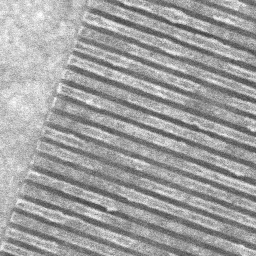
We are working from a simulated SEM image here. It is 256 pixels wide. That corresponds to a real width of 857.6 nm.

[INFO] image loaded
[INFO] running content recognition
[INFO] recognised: parallel lines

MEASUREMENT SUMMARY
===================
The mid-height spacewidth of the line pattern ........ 19.2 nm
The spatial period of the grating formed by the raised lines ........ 50.9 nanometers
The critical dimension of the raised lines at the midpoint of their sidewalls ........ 31.4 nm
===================